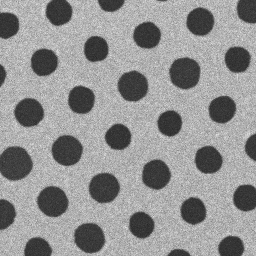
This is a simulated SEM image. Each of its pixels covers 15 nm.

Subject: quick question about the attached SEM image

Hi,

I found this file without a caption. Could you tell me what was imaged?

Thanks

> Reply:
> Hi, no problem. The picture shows a regular array of holes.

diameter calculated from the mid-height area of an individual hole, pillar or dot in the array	0.412	µm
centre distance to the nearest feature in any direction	782	nm